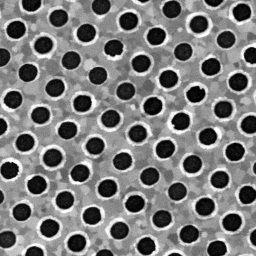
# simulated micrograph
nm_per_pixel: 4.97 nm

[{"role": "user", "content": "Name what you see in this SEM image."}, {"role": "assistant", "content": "a regular array of holes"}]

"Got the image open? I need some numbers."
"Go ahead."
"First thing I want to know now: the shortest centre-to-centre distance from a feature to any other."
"154 nm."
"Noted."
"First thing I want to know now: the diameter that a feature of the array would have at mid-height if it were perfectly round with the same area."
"94.6 nm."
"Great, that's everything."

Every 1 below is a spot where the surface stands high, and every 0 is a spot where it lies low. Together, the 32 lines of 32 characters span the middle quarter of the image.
00001111111111111000001111111111
10111110001111111000011111011111
11111100000111111111111100001111
11111100000111111111111100000111
11111110001111101111111100001111
11111111111110000011111100001111
11111111111110000011111111111110
11111111111110000011111111111100
11100001111111000111100111111110
11000001111111111111000001111111
11000001111111111111000001111111
11100011111001111111000011111111
11111111110000111111100111110001
11111111100000111111111111100000
00111111100000111111111111100000
00011111110001111000111111100001
00011111111111110000011111110011
00011111111111110000011111111111
00111110011111110000011111111111
11111100001111111000111100011111
11111000001111111111111000001111
11111000001111111111111000001111
11111100011110001111111000011111
11111111111100000111111100111100
11111111111100000111111111111100
11100011111100000111111111111100
11000011111111011111000111111100
10000011111111111110000011111111
11000011111111111110000011111111
11110111100001111110000111110111
11111111000001111111101111000011
11111111000001111111111111000001